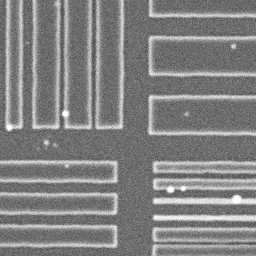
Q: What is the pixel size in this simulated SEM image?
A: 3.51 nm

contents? groups of lines, slits or small figures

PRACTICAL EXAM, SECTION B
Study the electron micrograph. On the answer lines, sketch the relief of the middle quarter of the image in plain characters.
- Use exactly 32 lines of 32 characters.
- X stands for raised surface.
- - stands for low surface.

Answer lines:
XXXXXX--XXXXXXX-------XXXXXXXXXX
XXXXXX--XXXXXXX-------XXXXXXXXXX
XXXXXX--XXXXXXX-------XXXXXXXXXX
XXXXXXX-XXXXXXX-----------------
XXXXXXX-XXXXXXX-----------------
XXXXXXX-XXXXXXX-----------------
XXXXXXX-XXXXXXX-----------------
XXXXXXX-XXXXXXX-----------------
XXXXXXX-XXXXXXX-------XXXXXXXXXX
XXXXXXX-XXXXXXX-------XXXXXXXXXX
XXXXXX--XXXXXXX-------XXXXXXXXXX
XXXXXX--XXXXXX--------XXXXXXXXXX
XXXXXXX-XXXXXX--------XXXXXXXXXX
XXXXXXX-XXXXXX--------XXXXXXXXXX
XXXXXXX-XXXXXX--------XXXXXXXXXX
XXXXXXX-XXXXXXX------XXXXXXXXXXX
---------------------XXXXXXXXXXX
---------------------XXXXXXXXX--
--------------------------------
--------------------------------
--------------------------------
--------------------------------
--------------------------------
--------------------------------
----XXX---X---------------------
XXXXXXXXXXXXX----------XXXXXXXXX
XXXXXXXXXXXXX----------XXXXXXXXX
XXXXXXXXXXXXX-------------------
XXXXXXXXXXXXX-------------------
--------XXX------------XXXXXXXXX
-----------------------XXXXXXXXX
--------------------------X--X--